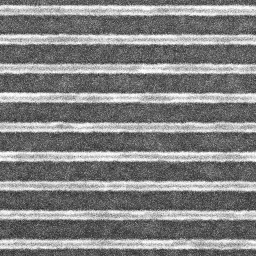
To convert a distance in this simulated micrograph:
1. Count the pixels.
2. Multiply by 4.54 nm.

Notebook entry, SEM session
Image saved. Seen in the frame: parallel lines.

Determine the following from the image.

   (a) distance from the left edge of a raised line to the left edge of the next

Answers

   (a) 0.133 micrometres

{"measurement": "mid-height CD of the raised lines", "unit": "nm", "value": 32.9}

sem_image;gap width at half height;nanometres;98.6